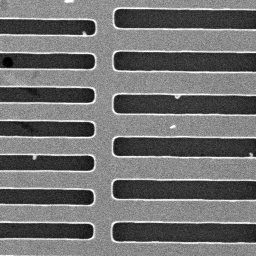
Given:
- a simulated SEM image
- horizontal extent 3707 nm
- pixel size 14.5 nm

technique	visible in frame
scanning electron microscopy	groups of lines, slits or small figures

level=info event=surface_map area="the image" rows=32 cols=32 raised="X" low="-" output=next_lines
XXXXXXXXXXXXXXXXXXXXXXXXXXXXXXXX
XXXXXXXXXXXXXX------------------
-----------XXX------------------
------------XXX-----------------
XXXXXXXXXXXXXXXXXXXXXXXXXXXXXXXX
XXXXXXXXXXXXXXXXXXXXXXXXXXXXXXXX
XXXXXXXXXXXXXXX-----------XXXXXX
------------XX------------------
-----------XXX------------------
XXXXXXXXXXXXXXXXXXXXXXXXXXXXXXXX
XXXXXXXXXXXXXXXXXXXXXXXXXXXXXXXX
------------XXXXXXXXXXXXXXXXXXXX
------------XX------------------
XXXXXXXXXXXXXX------------------
XXXXXXXXXXXXXXXXXXXXXXXXXXXXXXXX
------------XXXXXXXXXXXXXXXXXXXX
------------XXXXXXXXXXXXXXXXXXXX
XXXXXXXXXXXXXX------------------
XXXXXXXXXXXXXX------------------
-----------XXXX-----------------
------------XXXXXXXXXXXXXXXXXXXX
XXXXXXXXXXXXXXXXXXXXXXXXXXXXXXXX
XXXXXXXXXXXXXXX----------------X
-----XXXXXXXXX------------------
------------XX------------------
-----------XXXXXXXXXXXXXXXXXXXXX
XXXXXXXXXXXXXXXXXXXXXXXXXXXXXXXX
XXXXXXXXXXXXXXXXXXXXXXXXXXXXXXXX
------------XX------------------
------------XX------------------
XXXXXXXXXXXXXXXXXXXXXXXXXXXXXXXX
XXXXXXXXXXXXXXXXXXXXXXXXXXXXXXXX